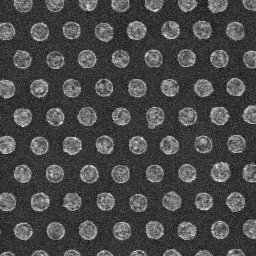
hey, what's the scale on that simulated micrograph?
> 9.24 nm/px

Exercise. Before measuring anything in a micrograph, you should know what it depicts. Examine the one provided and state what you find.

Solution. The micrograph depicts a regular array of raised bodies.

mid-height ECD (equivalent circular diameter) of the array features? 0.162 microns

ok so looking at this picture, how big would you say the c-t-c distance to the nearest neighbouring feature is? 296 nanometers